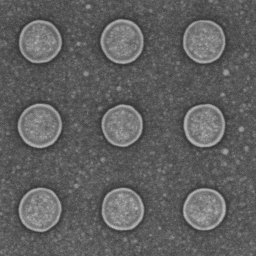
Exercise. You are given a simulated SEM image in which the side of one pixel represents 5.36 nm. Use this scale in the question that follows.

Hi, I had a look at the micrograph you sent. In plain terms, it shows a regular array of raised bodies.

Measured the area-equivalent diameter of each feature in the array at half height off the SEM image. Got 221 nm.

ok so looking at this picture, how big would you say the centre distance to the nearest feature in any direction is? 440 nm